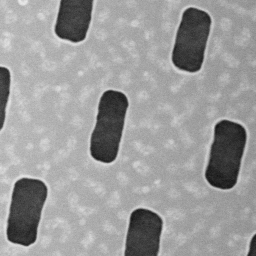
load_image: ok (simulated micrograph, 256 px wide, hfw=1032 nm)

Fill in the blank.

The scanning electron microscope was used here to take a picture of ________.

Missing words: holes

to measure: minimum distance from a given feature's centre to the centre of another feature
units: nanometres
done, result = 480